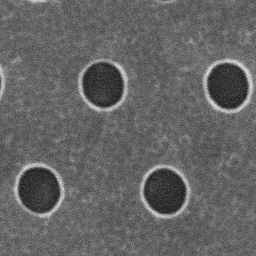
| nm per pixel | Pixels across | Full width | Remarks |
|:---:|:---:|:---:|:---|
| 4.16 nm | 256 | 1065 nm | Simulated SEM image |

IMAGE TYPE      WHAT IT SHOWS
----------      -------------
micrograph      holes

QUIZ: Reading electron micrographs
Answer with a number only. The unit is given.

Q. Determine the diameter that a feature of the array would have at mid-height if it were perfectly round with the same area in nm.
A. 189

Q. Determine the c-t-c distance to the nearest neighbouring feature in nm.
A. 512